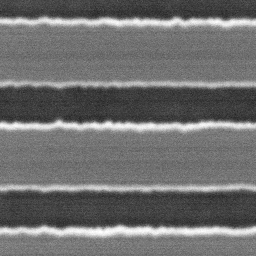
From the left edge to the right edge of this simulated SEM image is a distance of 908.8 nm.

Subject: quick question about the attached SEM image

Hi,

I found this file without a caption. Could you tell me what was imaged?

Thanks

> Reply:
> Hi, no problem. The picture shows lines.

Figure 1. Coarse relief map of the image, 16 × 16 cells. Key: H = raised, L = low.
LLLLLLLLLLLLLLLL
HHHHHHHHHHHHHHHH
HHHHHHHHHHHHHHHH
HHHHHHHHHHHHHHHH
HHHHHHHHHHHHHHHH
LLLLLLLLLLLLLLLL
LLLLLLLLLLLLLLLL
LLLLLLLLLLLLLLLL
HHHHHHHHHHHHHHHH
HHHHHHHHHHHHHHHH
HHHHHHHHHHHHHHHH
HHHHHHHHHHHHHHHH
LLLLLLLLLLLLLLLL
LLLLLLLLLLLLLLLL
HHHHHHHHHHHHHHHH
HHHHHHHHHHHHHHHH